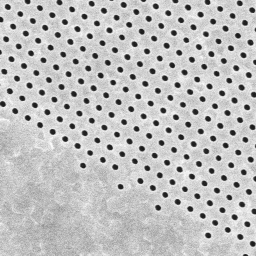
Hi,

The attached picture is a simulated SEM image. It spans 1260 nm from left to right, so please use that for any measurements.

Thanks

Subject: a regular array of holes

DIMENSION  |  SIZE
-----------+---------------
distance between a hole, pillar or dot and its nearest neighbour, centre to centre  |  69.8 nm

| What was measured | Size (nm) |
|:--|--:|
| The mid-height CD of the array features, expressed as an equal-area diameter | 29.9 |